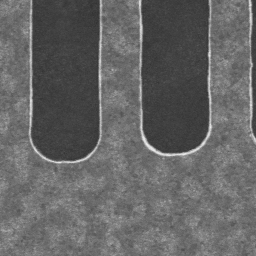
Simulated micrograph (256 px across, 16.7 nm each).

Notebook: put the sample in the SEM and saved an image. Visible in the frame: one or a few lines or trenches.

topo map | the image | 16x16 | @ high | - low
@@----@@@----@@@
@@----@@@----@@@
@@----@@@----@@@
@@----@@@----@@@
@@----@@@----@@@
@@----@@@----@@@
@@----@@@----@@@
@@----@@@----@@@
@@----@@@----@@@
@@----@@@@--@@@@
@@@@@@@@@@@@@@@@
@@@@@@@@@@@@@@@@
@@@@@@@@@@@@@@@@
@@@@@@@@@@@@@@@@
@@@@@@@@@@@@@@@@
@@@@@@@@@@@@@@@@